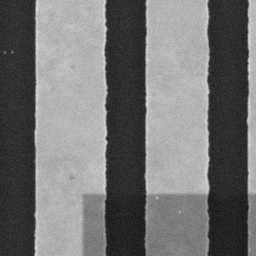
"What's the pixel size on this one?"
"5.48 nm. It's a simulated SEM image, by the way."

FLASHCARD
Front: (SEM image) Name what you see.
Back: lines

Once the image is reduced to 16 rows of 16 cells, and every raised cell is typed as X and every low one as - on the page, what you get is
--XXXXX--XXXX---
--XXXXX--XXXX---
--XXXXX--XXXX---
--XXXXX--XXXX---
--XXXXX--XXXX---
--XXXXX--XXXX---
--XXXXX--XXXX---
--XXXXX--XXXX--X
--XXXXX--XXXX---
--XXXXX--XXXX---
--XXXXX--XXXX---
--XXXXX--XXXX---
--XXXXX--XXXX---
--XXXXX--XXXX---
--XXXXX--XXXX---
--XXXXX--XXXX---